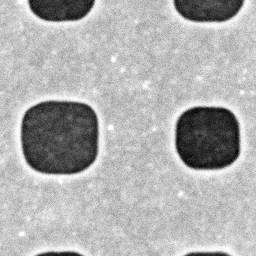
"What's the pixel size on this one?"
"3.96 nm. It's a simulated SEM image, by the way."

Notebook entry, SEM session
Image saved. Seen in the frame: holes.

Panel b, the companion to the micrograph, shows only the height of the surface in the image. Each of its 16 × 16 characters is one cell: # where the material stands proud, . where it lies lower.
##....#####....#
################
################
################
################
################
##...###########
#.....#####....#
#.....#####....#
#.....#####....#
##...#######..##
################
################
################
################
################